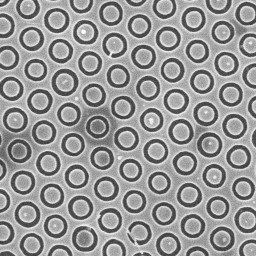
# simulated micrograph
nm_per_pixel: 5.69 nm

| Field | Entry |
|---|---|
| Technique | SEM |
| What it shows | a regular array of ring-shaped grooves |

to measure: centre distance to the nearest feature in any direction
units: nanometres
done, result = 174